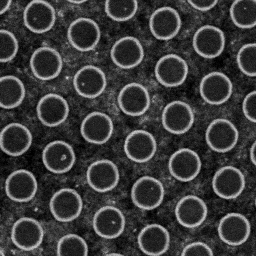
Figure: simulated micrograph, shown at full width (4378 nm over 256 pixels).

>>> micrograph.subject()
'a regular array of raised bodies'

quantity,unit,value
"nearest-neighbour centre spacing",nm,801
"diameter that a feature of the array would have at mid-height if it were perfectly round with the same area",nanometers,503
